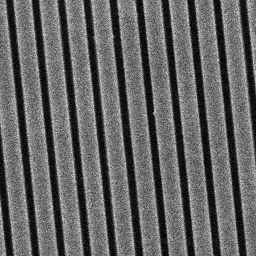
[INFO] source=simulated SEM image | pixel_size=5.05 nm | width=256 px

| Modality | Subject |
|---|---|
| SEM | parallel lines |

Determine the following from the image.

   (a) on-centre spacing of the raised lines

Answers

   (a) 130 nm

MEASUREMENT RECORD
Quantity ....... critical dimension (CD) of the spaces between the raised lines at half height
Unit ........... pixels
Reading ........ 7.47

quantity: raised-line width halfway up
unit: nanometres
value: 94.9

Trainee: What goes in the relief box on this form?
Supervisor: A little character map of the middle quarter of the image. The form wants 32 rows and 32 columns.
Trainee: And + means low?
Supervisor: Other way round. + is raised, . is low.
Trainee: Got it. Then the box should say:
..++++..+++++..+++++.+++++..++++
..++++...++++..+++++..++++..++++
..+++++..++++..+++++..++++..++++
..+++++..++++..+++++..++++..++++
..+++++..++++..+++++..++++..++++
...++++..+++++..++++..+++++.++++
+..++++..+++++..++++..+++++.++++
+..++++..+++++..++++..+++++..+++
+..++++..+++++..++++..+++++..+++
+..++++..+++++..++++..+++++..+++
+..++++..+++++..++++..+++++..+++
+..+++++..++++..+++++.+++++..+++
+..+++++..++++..+++++.+++++..+++
+..+++++..++++..+++++..++++..+++
+..+++++..++++..+++++..++++..+++
++..++++..+++++..++++..+++++..++
++..++++..+++++..++++..+++++..++
++..++++..+++++..++++..+++++..++
++..++++..+++++..++++..+++++..++
++..++++..+++++..++++..+++++..++
++..++++..+++++..+++++..++++..++
++..+++++..++++..+++++..++++..++
++..+++++..++++..+++++..++++..++
++..+++++..++++..+++++..++++..++
++...++++..++++...++++..++++...+
+++..++++..+++++..++++..+++++..+
+++..++++..+++++..++++..+++++..+
+++..++++..+++++..++++..+++++..+
+++..++++..+++++..++++..+++++..+
+++..++++..+++++..+++++.+++++..+
+++..++++...++++..+++++..++++..+
+++..+++++..++++..+++++..++++..+